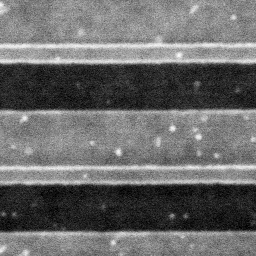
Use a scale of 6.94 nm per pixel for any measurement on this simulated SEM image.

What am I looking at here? lines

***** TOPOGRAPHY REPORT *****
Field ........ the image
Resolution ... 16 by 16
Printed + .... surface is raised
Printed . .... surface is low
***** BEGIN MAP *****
++++++++++++++++
++++++++++++++++
++++++++++++++++
++++++++++++++++
................
................
................
++++++++++++++++
++++++++++++++++
++++++++++++++++
++++++++++++++++
................
................
................
................
++++++++++++++++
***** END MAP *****